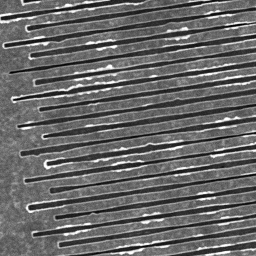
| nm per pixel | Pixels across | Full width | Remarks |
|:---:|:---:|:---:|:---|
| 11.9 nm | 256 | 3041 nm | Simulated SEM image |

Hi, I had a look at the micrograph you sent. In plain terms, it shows parallel lines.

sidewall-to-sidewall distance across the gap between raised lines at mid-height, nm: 51.4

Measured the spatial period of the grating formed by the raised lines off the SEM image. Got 163 nanometres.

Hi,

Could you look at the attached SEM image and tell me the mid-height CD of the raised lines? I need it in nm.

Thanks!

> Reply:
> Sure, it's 112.